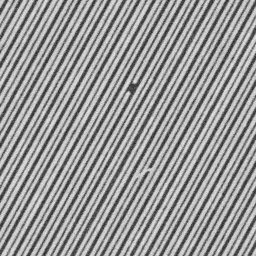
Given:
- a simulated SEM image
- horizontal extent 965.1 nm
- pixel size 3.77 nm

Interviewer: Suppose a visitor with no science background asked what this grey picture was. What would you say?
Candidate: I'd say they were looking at parallel lines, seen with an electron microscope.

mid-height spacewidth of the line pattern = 7.5 nm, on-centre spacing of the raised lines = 0.0243 µm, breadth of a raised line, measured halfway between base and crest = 14.4 nm